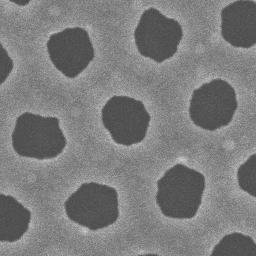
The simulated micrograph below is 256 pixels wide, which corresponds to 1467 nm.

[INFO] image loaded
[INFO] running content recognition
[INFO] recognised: holes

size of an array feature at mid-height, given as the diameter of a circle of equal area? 285 nm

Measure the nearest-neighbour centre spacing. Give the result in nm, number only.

505